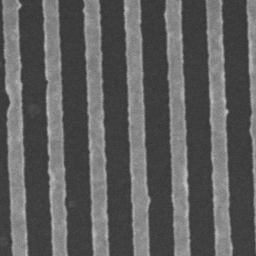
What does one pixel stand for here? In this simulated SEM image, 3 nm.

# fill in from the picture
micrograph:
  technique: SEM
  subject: parallel lines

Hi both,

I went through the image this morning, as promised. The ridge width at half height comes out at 43.9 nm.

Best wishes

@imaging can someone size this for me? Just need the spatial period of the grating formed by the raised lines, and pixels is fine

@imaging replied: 40.8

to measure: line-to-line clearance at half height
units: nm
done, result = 79.5